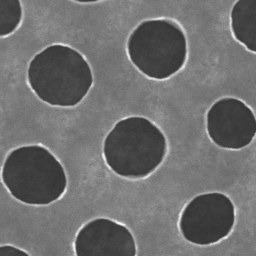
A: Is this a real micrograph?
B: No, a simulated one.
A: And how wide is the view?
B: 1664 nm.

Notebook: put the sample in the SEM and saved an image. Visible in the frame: holes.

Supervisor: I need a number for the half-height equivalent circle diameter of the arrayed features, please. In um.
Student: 0.39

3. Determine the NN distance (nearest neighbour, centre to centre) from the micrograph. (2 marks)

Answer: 662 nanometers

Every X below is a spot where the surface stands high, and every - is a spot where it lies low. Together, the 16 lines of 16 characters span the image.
-XXXXXXXXXXXXXX-
-XXXXXXXX--XXXX-
XXXXXXXX----XXX-
XX---XXX----XXXX
XX----XXX--XXXXX
XX----XXXXXXXXXX
XXX--XXXXXXXX--X
XXXXXXXX-XXXX---
XXXXXXX---XXX---
X--XXXX---XXXXXX
----XXX---XXXXXX
----XXXXXXXXXXXX
X--XXXXXXXXX--XX
XXXXXXXXXXX----X
XXXXX---XXX---XX
-XXXX---XXXXXXXX